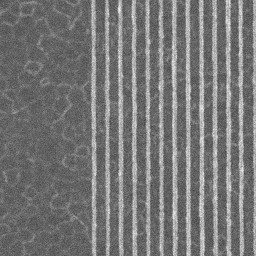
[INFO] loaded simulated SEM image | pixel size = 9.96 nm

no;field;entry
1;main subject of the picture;parallel lines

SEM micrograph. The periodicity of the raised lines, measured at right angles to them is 133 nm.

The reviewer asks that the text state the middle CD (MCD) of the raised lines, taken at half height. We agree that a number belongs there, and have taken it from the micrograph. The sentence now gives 29.9 nm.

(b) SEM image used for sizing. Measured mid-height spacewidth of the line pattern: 104 nm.